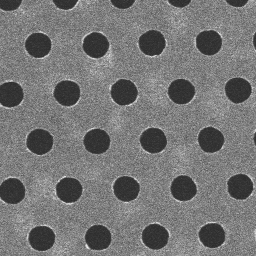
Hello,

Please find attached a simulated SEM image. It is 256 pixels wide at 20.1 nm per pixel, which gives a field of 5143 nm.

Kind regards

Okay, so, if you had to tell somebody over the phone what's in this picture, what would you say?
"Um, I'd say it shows a regular array of holes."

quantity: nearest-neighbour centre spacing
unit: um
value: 1.12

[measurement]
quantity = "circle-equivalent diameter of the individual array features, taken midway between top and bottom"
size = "529 nanometers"